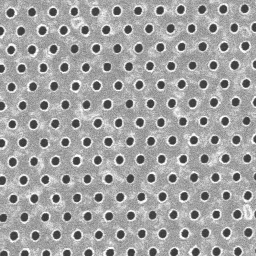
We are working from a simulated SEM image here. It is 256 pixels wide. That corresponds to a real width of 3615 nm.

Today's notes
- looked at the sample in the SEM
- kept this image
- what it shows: a regular array of holes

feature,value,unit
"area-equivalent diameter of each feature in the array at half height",119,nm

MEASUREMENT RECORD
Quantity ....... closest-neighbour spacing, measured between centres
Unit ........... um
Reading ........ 0.296